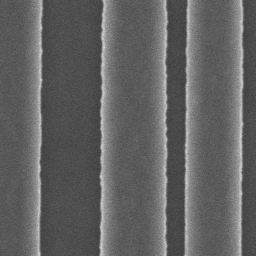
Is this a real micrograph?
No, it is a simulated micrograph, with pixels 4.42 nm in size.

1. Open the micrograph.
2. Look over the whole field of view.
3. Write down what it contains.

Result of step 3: lines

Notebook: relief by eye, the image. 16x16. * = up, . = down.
***...****..***.
***...****..***.
***...****..***.
***...****..***.
***...****..***.
***...****..***.
**....****..***.
***...****..***.
***...****..***.
***...****..***.
**....****..***.
**....****..***.
**....****..***.
**....****..***.
**....****..***.
**....****..***.